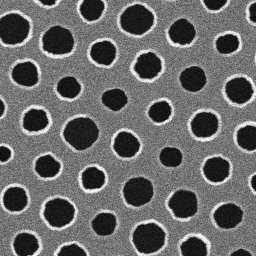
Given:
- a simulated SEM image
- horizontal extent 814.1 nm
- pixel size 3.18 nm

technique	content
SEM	a regular array of holes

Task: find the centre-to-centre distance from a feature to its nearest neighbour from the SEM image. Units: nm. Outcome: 148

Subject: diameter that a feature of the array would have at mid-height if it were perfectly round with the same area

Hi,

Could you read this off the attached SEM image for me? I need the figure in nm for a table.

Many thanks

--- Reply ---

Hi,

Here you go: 81.4